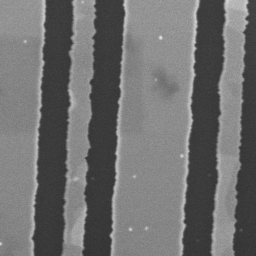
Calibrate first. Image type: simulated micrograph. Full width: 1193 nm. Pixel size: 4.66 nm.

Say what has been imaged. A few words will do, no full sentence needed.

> lines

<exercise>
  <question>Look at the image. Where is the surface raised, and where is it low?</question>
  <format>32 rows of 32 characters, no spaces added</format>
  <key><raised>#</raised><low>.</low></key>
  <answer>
######...###...##########...###.
######...###....#########...###.
######...###....#########...###.
######...###...##########...###.
######...###...#########....###.
######...###...#########....###.
#####....###...#########....###.
#####....###...#########....##..
#####....###...#########....##..
#####....###...#########....##..
#####....##....#########...###..
#####....##....#########...###..
#####....##....#########...###..
#####....##....#########...###..
#####....##....#########...###..
#####....##....#########...###..
#####...###....#########...###..
#####...###....#########...###..
#####...###....#########...###..
#####...###....#########...###..
#####...###...##########...###..
#####...###...##########...###..
#####...###...#########....###..
#####...###...#########....##...
####....###...#########....###..
####....###...#########....###..
####....###...#########....##...
####....###...#########....##...
####....##....#########....##...
####....##....#########...###...
####....##....#########...###...
####....##....#########...###...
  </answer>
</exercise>